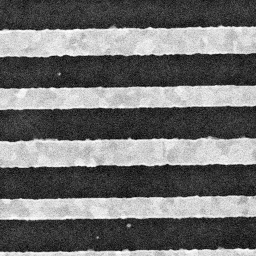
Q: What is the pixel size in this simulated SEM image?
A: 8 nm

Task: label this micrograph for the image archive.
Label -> lines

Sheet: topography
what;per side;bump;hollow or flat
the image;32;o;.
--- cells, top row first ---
................................
................................
................................
.......................ooooooooo
oooooooooooooooooooooooooooooooo
oooooooooooooooooooooooooooooooo
oooooooooooooooooooooooooooooooo
................................
................................
................................
................................
oooooooooooooooooooooooooooooooo
oooooooooooooooooooooooooooooooo
ooooooooo.......................
................................
................................
................................
................o..oooo.ooo..ooo
oooooooooooooooooooooooooooooooo
oooooooooooooooooooooooooooooooo
oooooooooooooooooooooooooo..o...
................................
................................
................................
................................
oooooooooooooooooooooooooooooooo
oooooooooooooooooooooooooooooooo
................................
................................
................................
................................
.........ooooooooooooooooooooooo